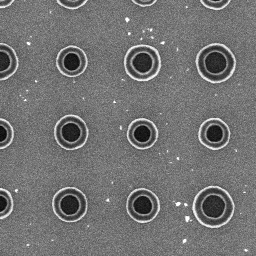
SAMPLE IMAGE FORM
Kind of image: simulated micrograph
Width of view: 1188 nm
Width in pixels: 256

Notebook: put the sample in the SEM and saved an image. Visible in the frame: a regular array of ring-shaped raised bodies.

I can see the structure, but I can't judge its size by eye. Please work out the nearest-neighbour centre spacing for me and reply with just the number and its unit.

329 nanometers